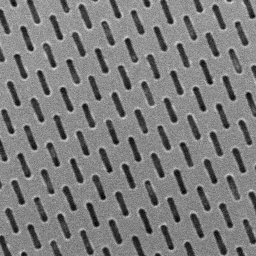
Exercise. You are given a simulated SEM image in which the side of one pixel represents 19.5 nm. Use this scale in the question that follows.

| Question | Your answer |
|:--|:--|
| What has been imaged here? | a regular array of holes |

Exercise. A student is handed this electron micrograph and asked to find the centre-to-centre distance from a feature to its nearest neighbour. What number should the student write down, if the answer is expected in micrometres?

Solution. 0.541